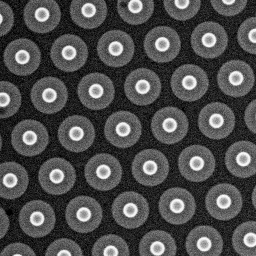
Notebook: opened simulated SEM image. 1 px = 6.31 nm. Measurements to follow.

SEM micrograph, an array of small figures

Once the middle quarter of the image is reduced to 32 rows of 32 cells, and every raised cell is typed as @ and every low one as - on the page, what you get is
@@@@@------@@@---------------@@@
@@@---------------@@@-------@@@@
------@@@@------@@@@@@@----@@@@@
-----@@@@@@-----@@@@@@@@---@@@@@
----@@@@@@@@---@@@@@@@@@---@@@@@
----@@@@@@@@---@@@@@@@@@---@@@@@
@--@@@@@@@@@@--@@@@@@@@@---@@@@@
@--@@@@@@@@@@--@@@@@@@@@----@@@@
@---@@@@@@@@----@@@@@@@------@@@
@---@@@@@@@@-----@@@@@----------
-----@@@@@@---------------------
------------------------@@@@@---
------------@@@@@------@@@@@@@--
-@@@@@-----@@@@@@@----@@@@@@@@@-
@@@@@@@---@@@@@@@@@---@@@@@@@@@-
@@@@@@@---@@@@@@@@@---@@@@@@@@@-
@@@@@@@@--@@@@@@@@@---@@@@@@@@@-
@@@@@@@@--@@@@@@@@@---@@@@@@@@--
@@@@@@@@---@@@@@@@@----@@@@@@@--
@@@@@@@----@@@@@@@------@@@@----
@@@@@@@------@@@@---------------
-@@@@---------------@@@-------@@
---------@@-------@@@@@@@----@@@
-------@@@@@@-----@@@@@@@----@@@
@-----@@@@@@@@---@@@@@@@@@---@@@
@@---@@@@@@@@@---@@@@@@@@@---@@@
@@@--@@@@@@@@@---@@@@@@@@@---@@@
@@@--@@@@@@@@@---@@@@@@@@@---@@@
@@@--@@@@@@@@@----@@@@@@@-----@@
@@@---@@@@@@@@-----@@@@@@-------
@@-----@@@@@@-------------------
@--------@@---------------@@@@--